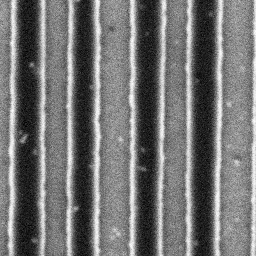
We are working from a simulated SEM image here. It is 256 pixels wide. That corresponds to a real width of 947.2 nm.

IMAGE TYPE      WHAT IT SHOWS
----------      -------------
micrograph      lines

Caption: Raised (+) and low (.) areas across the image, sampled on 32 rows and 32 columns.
..++++...+++....+++++...++++....
..++++...+++....+++++..+++++....
..++++...+++....+++++...++++....
..++++...+++.....++++..+++++....
..++++...+++....+++++..+++++....
.+++++...+++....+++++..+++++....
..++++...+++....+++++..+++++....
..++++...+++....+++++..+++++....
..++++...+++....+++++..+++++....
.+++++...+++.....+++...+++++....
.+++++...+++....++++...+++++....
.+++++...+++....++++...+++++....
..++++...+++....++++...+++++....
.++++...++++....++++...+++++....
.+++++...+++....++++...+++++....
.+++++...+++....++++...+++++....
.+++++...+++....++++...++++.....
.++++....+++....++++...++++.....
.+++++...+++....++++...++++.....
.+++++...+++.....+++...++++.....
.+++++...+++....++++...++++.....
.+++++..++++....++++...++++.....
.+++++..++++....++++...++++.....
.++++...++++....++++...++++.....
.+++++..++++....++++...++++.....
.+++++...+++....++++...++++.....
.+++++..++++....++++...++++.....
.+++++..++++....++++...++++.....
.+++++..++++....++++...++++.....
.+++++..++++....++++...++++.....
.+++++..++++....++++...++++.....
.++++...++++....++++...++++.....